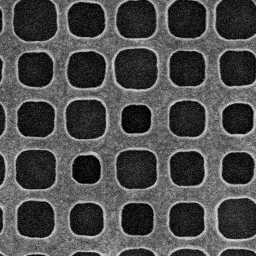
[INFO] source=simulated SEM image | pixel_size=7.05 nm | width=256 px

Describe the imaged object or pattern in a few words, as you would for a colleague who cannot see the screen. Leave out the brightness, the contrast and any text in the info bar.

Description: a regular array of holes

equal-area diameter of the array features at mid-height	273	nanometres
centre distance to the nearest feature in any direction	351	nanometres